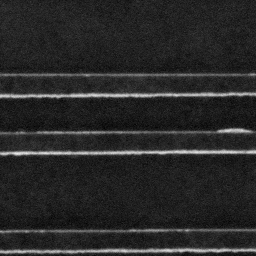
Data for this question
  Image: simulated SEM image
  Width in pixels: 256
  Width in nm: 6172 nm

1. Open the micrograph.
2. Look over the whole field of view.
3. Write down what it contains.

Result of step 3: lines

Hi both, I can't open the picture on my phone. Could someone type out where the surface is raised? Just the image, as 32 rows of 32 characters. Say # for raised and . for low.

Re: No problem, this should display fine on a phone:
................................
................................
................................
................................
................................
................................
................................
................................
................................
################################
################################
################################
................................
................................
................................
................................
..............................##
################################
################################
................................
................................
................................
................................
................................
................................
................................
................................
................................
................................
################################
################################
#...............................